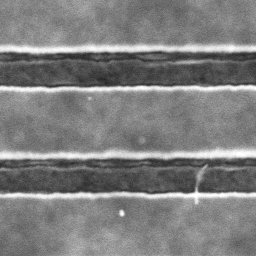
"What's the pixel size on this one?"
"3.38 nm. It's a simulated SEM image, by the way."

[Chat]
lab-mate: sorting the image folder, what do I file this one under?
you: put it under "lines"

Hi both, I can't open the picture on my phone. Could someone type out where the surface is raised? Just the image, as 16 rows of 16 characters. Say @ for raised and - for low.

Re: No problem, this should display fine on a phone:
@@@@@@@@@@@@@@@@
@@@@@@@@@@@@@@@@
@@@@@@@@@@@@@@@@
----------------
----------------
@@@@@@@@@@@@@@@@
@@@@@@@@@@@@@@@@
@@@@@@@@@@@@@@@@
@@@@@@@@@@@@@@@@
@@@@@@@@@@@@@@@@
----------------
----------------
@@@@@@@@@@@@@@@@
@@@@@@@@@@@@@@@@
@@@@@@@@@@@@@@@@
@@@@@@@@@@@@@@@@